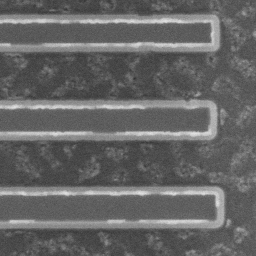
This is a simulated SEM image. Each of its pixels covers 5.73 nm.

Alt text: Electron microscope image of one or a few lines or trenches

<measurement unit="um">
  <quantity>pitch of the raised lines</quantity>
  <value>0.498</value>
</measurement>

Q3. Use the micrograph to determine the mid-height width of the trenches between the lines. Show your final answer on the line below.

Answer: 309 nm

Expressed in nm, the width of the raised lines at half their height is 196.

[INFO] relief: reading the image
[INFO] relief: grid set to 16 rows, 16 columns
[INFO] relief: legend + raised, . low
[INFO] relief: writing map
................
+++++++++++++...
++++++++++++++..
................
................
................
+++++++++++++...
+++++++++++++...
+++++++++++++...
................
................
................
++++++++++++++..
++++++++++++++..
................
................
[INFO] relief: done